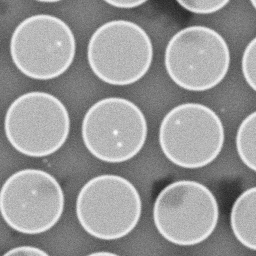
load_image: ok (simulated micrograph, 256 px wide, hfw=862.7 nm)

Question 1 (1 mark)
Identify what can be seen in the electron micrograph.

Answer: an array of small figures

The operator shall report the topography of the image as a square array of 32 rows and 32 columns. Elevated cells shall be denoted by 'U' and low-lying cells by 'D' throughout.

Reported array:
DDDDDDDDDDDDDDUUUDDDDDDUUUUUDDDD
DDDDDDDDDDDDDDDDDDDDDDDDDUDDDDDD
DDDUUUUDDDDDDDDDDDDDDDDDDDDDDDDD
DDUUUUUUDDDDDUUUUDDDDDDDUUDDDDDD
DDUUUUUUUDDDUUUUUUDDDDUUUUUDDDDD
DUUUUUUUUDDUUUUUUUUDDUUUUUUUDDDU
DUUUUUUUUDDUUUUUUUUDDUUUUUUUUDDU
DDUUUUUUUDDUUUUUUUUDDUUUUUUUUDUU
DDUUUUUUDDDDUUUUUUDDDUUUUUUUDDUU
DDDDUUUDDDDDUUUUUUDDDUUUUUUUDDDU
DDDDDDDDDDDDDDDUDDDDDDUUUUUDDDDU
DDDDDDDDDDDDDDDDDDDDDDDDDDDDDDDD
DDUUUUUDDDDDDUUUDDDDDDDDDDDDDDDD
DUUUUUUUDDDUUUUUUDDDDDUUUUDDDDDD
DUUUUUUUDDDUUUUUUUDDDUUUUUUDDDDU
DUUUUUUUUDUUUUUUUUDDUUUUUUUUDDUU
DUUUUUUUDDUUUUUUUUDDUUUUUUUUDDUU
DUUUUUUUDDDUUUUUUUDDUUUUUUUUDDUU
DDUUUUUDDDDUUUUUUUDDUUUUUUUUDDUU
DDDDDDDDDDDDUUUUUDDDDUUUUUUDDDUU
DDDDDDDDDDDDDDDDDDDDDDUUUUDDDDDU
DDUUUDDDDDDDDDDDDDDDDDDDDDDDDDDD
DUUUUUUDDDDDUUUUDDDDDDDDDDDDDDDD
UUUUUUUDDDUUUUUUUDDDDUUUUUDDDDDD
UUUUUUUUDDUUUUUUUDDDUUUUUUUDDDUU
UUUUUUUUDDUUUUUUUUDUUUUUUUUDDUUU
UUUUUUUUDDUUUUUUUDDUUUUUUUUDDUUU
DUUUUUUDDDUUUUUUUDDUUUUUUUUDDUUU
DDUUUUDDDDDUUUUUUDDDUUUUUUUDDUUU
DDDDDDDDDDDDUUUDDDDDDUUUUUDDDDUU
DDDDDDDDDDDDDDDDDDDDDDUUDDDDDDDU
DUUUUDDDDDDDDDDDDDDDDDDDDDDDDDDD